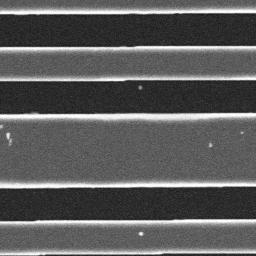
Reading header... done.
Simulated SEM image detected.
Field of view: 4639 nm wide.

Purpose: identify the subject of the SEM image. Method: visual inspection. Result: lines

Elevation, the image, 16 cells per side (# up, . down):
################
................
................
################
################
................
................
################
################
################
################
################
................
................
################
################